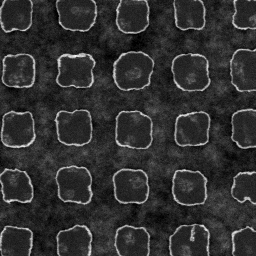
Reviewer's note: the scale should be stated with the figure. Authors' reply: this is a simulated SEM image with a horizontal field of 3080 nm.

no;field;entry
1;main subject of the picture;a regular array of raised bodies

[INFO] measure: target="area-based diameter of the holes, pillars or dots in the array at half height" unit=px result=37.4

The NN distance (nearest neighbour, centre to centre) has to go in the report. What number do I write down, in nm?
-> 682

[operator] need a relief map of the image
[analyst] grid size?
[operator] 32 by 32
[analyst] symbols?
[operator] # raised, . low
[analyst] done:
####...#####...###....###....###
####...#####...####...####...###
####...#####...####...####...###
###.....###....###....###.....##
................................
................................
................##............##
####...#####...####...####...###
####...#####..#####...####...###
####...#####..#####...####...###
.###...####....###....####...###
................................
................................
................................
.###...####....###.....###...###
####...####....####...####...###
####...####....####...####...###
####...####....####...####...###
.................#..............
................................
................................
###....####....###....###.......
####...####...####....####...###
####...####...####....####...###
####...####...####....####...###
.......................##.......
................................
................................
.##......##....##.....####......
####...####....####..#####...###
####...####...#####..#####...###
####...####....####..#####...###